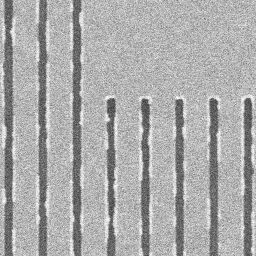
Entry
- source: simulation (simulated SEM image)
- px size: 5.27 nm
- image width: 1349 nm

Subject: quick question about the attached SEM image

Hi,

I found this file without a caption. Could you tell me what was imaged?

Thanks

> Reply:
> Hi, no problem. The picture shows parallel lines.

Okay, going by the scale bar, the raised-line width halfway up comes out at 137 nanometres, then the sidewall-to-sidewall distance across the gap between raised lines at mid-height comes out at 0.0422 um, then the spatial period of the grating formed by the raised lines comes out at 180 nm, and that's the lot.